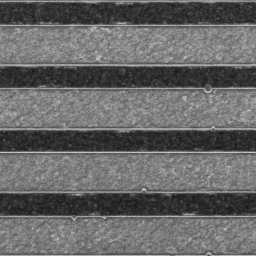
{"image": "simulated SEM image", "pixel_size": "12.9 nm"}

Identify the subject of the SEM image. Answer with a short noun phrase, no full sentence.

one or a few lines or trenches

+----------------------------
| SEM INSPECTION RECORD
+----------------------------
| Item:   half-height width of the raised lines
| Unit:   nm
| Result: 314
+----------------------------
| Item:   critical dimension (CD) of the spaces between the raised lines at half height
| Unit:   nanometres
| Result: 514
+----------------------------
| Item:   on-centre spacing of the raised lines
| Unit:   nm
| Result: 823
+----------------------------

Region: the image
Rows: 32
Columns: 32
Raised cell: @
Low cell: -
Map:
@@@@@@@@@@@--@@@@@@@@@@@@@@@@@@@
@@@@@@@@@@@@--@@@@@@@@@@@@@@@@@-
-@@@@@@@@@@@@@@@@@@@@@@@@@@@@@--
--------------------------------
--------------------------------
--------------------------------
--------------------------------
--------------------------------
@@@--@@@@@@@@@@@@@@@@@-@@@@@@@@@
@@@@@@@@@@@@@@@@@@@@@@@@@@@@@@@@
@@@@@@@@@@@@@@@@@@@@@@@@@@@@@@@@
--------------------------------
--------------------------------
--------------------------------
--------------------------------
--------------------------------
@@@@@@@-@--@@@@@@@---@@@@-@@@@@@
@@@@@@@@@--@@@@@@@@--@@@@@@@@@@@
@@@@@@@@@@@@@@@@@@@@@@@@@@@@@@@@
--------------------------------
--------------------------------
--------------------------------
--------------------------------
--------------------------------
@@@@@@@@@@@@@@@@@@@@@@@@@@-@@@@@
@@@@@@@@@@@@@@@@@@@@@@@@@@@@@@@@
@@@@@@@@@@@@@@@@@@@@@@@@@@@@@@@@
--------------------------------
--------------------------------
--------------------------------
--------------------------------
--------------------------------